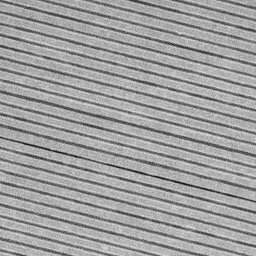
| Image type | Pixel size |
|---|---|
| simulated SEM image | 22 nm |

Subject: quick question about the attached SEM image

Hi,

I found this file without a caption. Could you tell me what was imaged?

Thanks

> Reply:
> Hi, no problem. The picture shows parallel lines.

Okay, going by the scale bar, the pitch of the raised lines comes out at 242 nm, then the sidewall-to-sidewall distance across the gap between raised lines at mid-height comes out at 77.4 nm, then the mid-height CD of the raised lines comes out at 157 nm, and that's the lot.